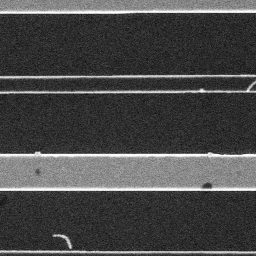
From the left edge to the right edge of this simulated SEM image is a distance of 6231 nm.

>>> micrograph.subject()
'lines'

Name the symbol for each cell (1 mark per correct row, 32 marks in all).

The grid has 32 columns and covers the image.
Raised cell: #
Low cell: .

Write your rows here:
################################
################................
................................
................................
................................
................................
................................
................................
................................
......................##########
################################
###############..........#......
................................
................................
................................
................................
................................
................................
................................
################################
################################
################################
################################
################################
................................
................................
................................
................................
................................
................................
................................
##..............................